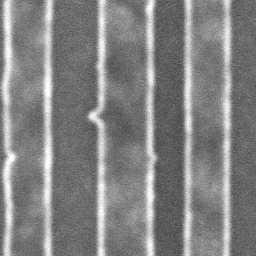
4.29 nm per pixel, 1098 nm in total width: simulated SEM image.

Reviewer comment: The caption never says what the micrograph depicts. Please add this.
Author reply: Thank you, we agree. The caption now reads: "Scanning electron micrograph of one or a few lines or trenches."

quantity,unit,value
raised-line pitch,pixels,89.9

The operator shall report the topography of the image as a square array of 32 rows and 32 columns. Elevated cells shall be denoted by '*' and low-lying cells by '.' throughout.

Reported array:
.*****.......******....*****....
.*****.......******....*****....
.*****.......******....*****....
.*****.......******....*****....
.*****.......******....*****....
.*****.......******....*****....
.*****.......******....*****....
.*****.......******....*****....
.*****......*******....*****....
.*****.......******....******...
.*****.......******....******...
.*****.......******....*****....
.*****.......******....*****....
.*****......*******....*****....
.*****.....********....*****....
.*****......*******....*****....
.*****.......******....*****....
.*****.......******....*****....
.*****.......******....*****....
.*****.......******....*****....
.*****.......******....*****....
.*****.......******....*****....
.*****.......******....*****....
.*****.......******....*****....
.*****.......******....*****....
.*****.......******....*****....
.*****.......******....*****....
.*****.......******....*****....
.*****.......******....*****....
.*****.......******....*****....
.*****.......******....*****....
.*****.......******....*****....